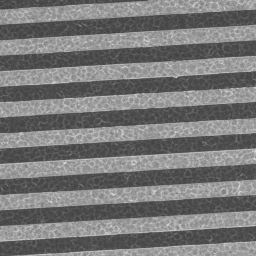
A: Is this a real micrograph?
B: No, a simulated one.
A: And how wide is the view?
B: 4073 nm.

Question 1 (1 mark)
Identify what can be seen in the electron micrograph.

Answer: parallel lines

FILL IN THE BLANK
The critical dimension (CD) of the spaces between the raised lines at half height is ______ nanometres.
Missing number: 258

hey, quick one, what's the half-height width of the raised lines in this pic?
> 228 nanometres